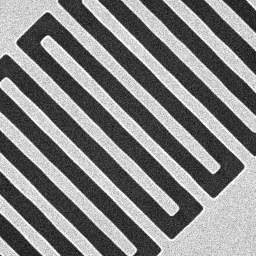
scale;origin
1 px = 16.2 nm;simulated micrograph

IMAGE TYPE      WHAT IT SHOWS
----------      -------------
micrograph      groups of lines, slits or small figures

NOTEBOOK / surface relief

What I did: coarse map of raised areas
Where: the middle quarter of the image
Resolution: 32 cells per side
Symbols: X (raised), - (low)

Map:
XXXX------XXXX-------XXXX------X
XXXXX------XXXX-------XXXX------
-XXXXX------XXXX------XXXXX-----
--XXXXX------XXXX------XXXXX----
---XXXXX------XXXX------XXXXX---
-----XXXX------XXXX------XXXXX--
-----XXXXX------XXXX------XXXXX-
X------XXXX------XXXX------XXXXX
XX------XXXX------XXXX------XXXX
XX-------XXXX------XXXX------XXX
XXX-------XXXX------XXXX------XX
XXXXX------XXXX------XXXX------X
-XXXX-------XXXX------XXXX------
--XXXX-------XXXX------XXXX-----
---XXXX-------XXXX------XXXX----
----XXXX-------XXXX------XXXX---
-----XXXXX------XXXX------XXXX--
------XXXX-------XXXX------XXXX-
X------XXXX-------XXXX------XXXX
XX------XXXX-------XXXX------XXX
XXX------XXXX------XXXXX------XX
XXXX------XXXX-------XXXX------X
-XXXX------XXXXX------XXXX------
--XXXX------XXXX-------XXXX-----
---XXXX------XXXXX------XXXX----
----XXXX------XXXXX------XXXX---
-----XXXX------XXXX------XXXXX--
------XXXX------XXXXX------XXXX-
X------XXXX------XXXX-------XXXX
XX------XXXX------XXXX-------XXX
XXX------XXXX------XXXXX------XX
XXXX------XXXX------XXXX------XX